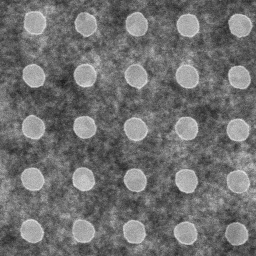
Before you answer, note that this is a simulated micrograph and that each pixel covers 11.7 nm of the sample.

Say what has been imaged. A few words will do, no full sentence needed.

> a regular array of raised bodies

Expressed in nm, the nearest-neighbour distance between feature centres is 597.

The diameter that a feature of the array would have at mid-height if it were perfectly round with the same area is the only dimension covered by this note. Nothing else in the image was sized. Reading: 0.261 µm